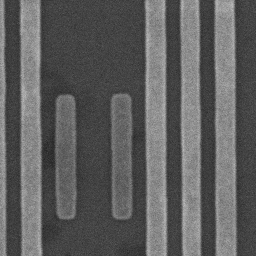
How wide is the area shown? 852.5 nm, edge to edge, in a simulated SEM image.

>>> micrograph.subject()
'wiring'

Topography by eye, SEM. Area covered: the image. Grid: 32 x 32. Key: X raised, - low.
---XX-------------XXX--XX--XX---
---XX-------------XXX--X---XX---
---XX-------------XXX--XX--XX---
---XX-------------XXX--XX--XX---
X--XX-------------XXX--XX--XX---
X--XX-------------XXX--XX--XX---
---XX-------------XXX--XX--XX---
---XX-------------XXX--XX--XX---
X--XX-------------XXX--XX--XX---
---XX-------------XXX--XX--XX---
X--XX-------------XXX--XX--XX---
X--XX-------------XXX--XX--XX---
X--XX---X-----XX--XXX--XX--XX---
X--XX--XX-----XX--XXX--XX--XX---
X--XX--XX-----XX--XXX--XX--XX---
X--XX--XX-----XX--XXX--XX--XX---
X--XX--XX-----XX--XXX--XX--XX---
X--XX--XX-----XX--XXX--XX--XX---
X--XX--XX-----XX--XXX--XX--XX---
---XX--XX-----XX--XXX--XX--XX---
---XX--XX-----XX--XXX--XX--XX---
---XX--XX-----XX--XXX--XX--XX---
X--XX--XX------X--XXX--XX--XX---
---XX--XX-----X---XXX--XX--XX---
X--XX--XX-----XX--XXX--XX--XX---
X--XX--XX-----XX--XXX--XX--XX---
---XX--XX-----XX--XXX--XX--XX---
---XX-------------XXX--XX--XX---
X--XX-------------XXX--XX--XX---
X--XX-------------XXX--XX--XX---
X--XX-------------XXX--XX--XX---
X--XX-------------XXX--XX--XX---